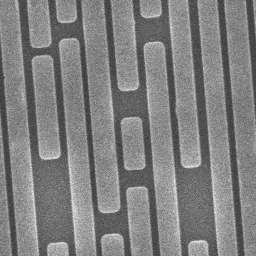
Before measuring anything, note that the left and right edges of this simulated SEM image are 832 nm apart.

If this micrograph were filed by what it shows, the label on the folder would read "parallel lines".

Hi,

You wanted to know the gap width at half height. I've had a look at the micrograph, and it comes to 25.5 nm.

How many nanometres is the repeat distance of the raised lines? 92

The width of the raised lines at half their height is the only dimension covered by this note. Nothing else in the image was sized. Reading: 0.0659 um